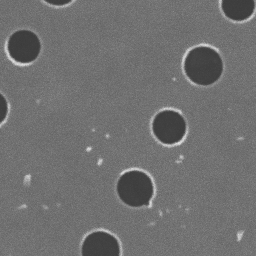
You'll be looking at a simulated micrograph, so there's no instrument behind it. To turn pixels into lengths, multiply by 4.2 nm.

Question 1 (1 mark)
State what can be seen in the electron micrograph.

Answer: holes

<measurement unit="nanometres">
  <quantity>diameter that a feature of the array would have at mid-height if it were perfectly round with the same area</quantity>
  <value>149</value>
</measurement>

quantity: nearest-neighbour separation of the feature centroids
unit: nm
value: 295